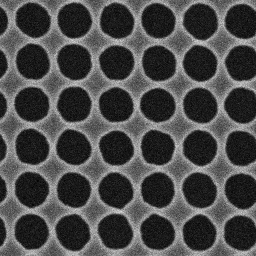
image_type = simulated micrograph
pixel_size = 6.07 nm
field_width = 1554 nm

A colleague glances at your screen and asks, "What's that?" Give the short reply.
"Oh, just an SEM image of a regular array of holes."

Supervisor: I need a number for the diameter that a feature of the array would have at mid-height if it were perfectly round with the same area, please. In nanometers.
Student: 214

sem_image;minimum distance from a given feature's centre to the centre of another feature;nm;253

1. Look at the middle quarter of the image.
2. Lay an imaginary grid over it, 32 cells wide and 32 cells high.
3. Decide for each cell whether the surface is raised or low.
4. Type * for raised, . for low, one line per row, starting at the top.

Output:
.......**.........**........**..
.......**........***........**..
......****.......***........***.
*....******.....*****.....******
********************************
********************************
.....******....******....*******
......***.......****.......****.
.......**........**........***..
.......**........**.........**..
.......**........**.........**..
.......**........**.........**..
......***........***.......***..
......****......*****......****.
*.**********...*******...*******
********************************
..*******************..*********
.....*****.....*****......*****.
......***.......****.......***..
......***........**.........**..
.......**........**.........**..
.......**.........*.........**..
.......***........*........***..
......****.......***.......****.
.....*****......*****.....******
************..******************
********************************
....*******...********....******
......****......****.......****.
......***........***.......***..
.......**........**........***..
.......*.........**.........**..